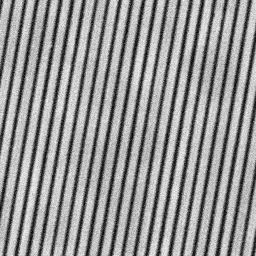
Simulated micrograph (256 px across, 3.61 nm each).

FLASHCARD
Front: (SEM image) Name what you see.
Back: parallel lines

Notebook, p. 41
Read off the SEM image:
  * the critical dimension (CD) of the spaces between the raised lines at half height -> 18.2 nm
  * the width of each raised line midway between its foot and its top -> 0.0253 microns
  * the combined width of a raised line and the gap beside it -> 42.1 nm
